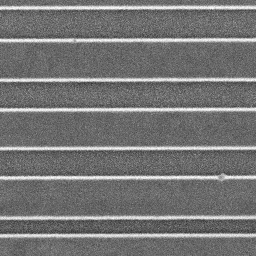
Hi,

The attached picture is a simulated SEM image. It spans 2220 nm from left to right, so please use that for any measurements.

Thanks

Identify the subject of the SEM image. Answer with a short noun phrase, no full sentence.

one or a few lines or trenches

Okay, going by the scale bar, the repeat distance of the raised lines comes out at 68.7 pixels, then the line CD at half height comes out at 350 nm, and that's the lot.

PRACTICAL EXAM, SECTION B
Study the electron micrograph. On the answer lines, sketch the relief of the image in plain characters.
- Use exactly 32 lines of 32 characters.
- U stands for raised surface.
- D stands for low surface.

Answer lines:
UUUUUUUUUUUUUUUUUUUUUUUUUUUUUUUU
DDDDDDDDDDDDDDDDDDDDDDDDDDDDDDDD
DDDDDDDDDDDDDDDDDDDDDDDDDDDDDDDD
DDDDDDDDDDDDDDDDDDDDDDDDDDDDDDDD
DDDDDDDDDDDDDDDDDDDDDDDDDDDDDDDD
UUUUUUUUUUUUUUUUUUUUUUUUUUUUUUUU
UUUUUUUUUUUUUUUUUUUUUUUUUUUUUUUU
UUUUUUUUUUUUUUUUUUUUUUUUUUUUUUUU
UUUUUUUUUUUUUUUUUUUUUUUUUUUUUUUU
UUUUUUUUUUUUUUUUUUUUUUUUUUUUUUUU
DDDDDDDDDDDDDDDDDDDDDDDDDDDDDDDD
DDDDDDDDDDDDDDDDDDDDDDDDDDDDDDDD
DDDDDDDDDDDDDDDDDDDDDDDDDDDDDDDD
DDDDDDDDDDDDDDDDDDDDDDDDDDDDDDDD
UUUUUUUUUUUUUUUUUUUUUUUUUUUUUUUU
UUUUUUUUUUUUUUUUUUUUUUUUUUUUUUUU
UUUUUUUUUUUUUUUUUUUUUUUUUUUUUUUU
UUUUUUUUUUUUUUUUUUUUUUUUUUUUUUUU
UUUUUUUUUUUUUUUUUUUUUUUUUUUUUUUU
DDDDDDDDDDDDDDDDDDDDDDDDDDDDDDDD
DDDDDDDDDDDDDDDDDDDDDDDDDDDDDDDD
DDDDDDDDDDDDDDDDDDDDDDDDDDDDDDDD
UUUUUUUUUUUUUUUUUUUUUUUUUUUUUUUU
UUUUUUUUUUUUUUUUUUUUUUUUUUUUUUUU
UUUUUUUUUUUUUUUUUUUUUUUUUUUUUUUU
UUUUUUUUUUUUUUUUUUUUUUUUUUUUUUUU
UUUUUUUUUUUUUUUUUUUUUUUUUUUUUUUU
DDDDDDDDDDDDDDDDDDDDDDDDDDDDDDDD
DDDDDDDDDDDDDDDDDDDDDDDDDDDDDDDD
UUUUUUUUUUUUUDDUUUUUUUUUUUUUUUUU
UUUUUUUUUUUUUUUUUUUUUUUUUUUUUUUU
UUUUUUUUUUUUUUUUUUUUUUUUUUUUUUUU